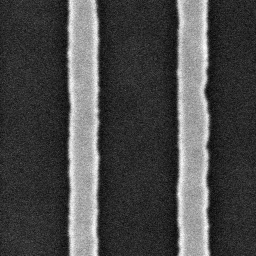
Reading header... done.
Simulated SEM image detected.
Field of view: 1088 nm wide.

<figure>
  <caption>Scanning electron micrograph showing lines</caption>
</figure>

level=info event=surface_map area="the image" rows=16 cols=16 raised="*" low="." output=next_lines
....**.....**...
....**.....**...
....**.....**...
....**.....**...
....**.....**...
....**.....**...
....**.....**...
....**.....**...
....**.....**...
....**.....**...
....**.....**...
....**.....**...
....**.....**...
....**.....**...
....**.....**...
....**.....**...